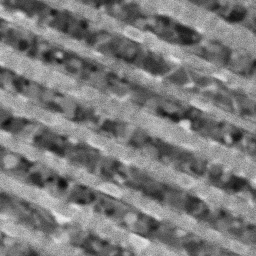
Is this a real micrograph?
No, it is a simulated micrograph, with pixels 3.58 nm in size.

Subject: parallel lines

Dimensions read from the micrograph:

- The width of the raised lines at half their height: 75.2 nm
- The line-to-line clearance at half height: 59.4 nanometers